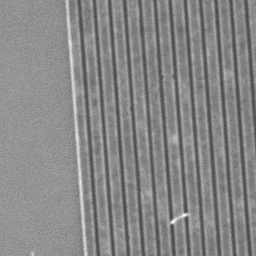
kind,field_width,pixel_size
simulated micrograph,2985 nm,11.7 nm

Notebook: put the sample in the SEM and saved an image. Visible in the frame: parallel lines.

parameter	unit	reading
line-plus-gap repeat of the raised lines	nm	176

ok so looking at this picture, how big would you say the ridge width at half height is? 0.119 micrometres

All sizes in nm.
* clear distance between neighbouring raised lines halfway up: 65.4